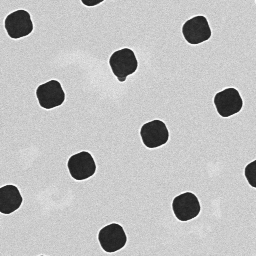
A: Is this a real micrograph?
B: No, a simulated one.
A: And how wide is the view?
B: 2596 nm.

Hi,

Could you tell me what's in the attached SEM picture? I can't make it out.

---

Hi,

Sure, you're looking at a regular array of holes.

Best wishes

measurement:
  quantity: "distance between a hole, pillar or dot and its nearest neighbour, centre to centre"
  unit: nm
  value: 790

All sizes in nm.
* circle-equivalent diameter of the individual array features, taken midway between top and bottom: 288